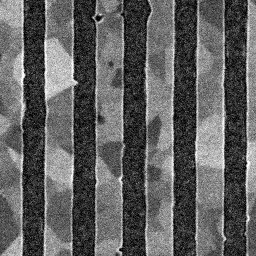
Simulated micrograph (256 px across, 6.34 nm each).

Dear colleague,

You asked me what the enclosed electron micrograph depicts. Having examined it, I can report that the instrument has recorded parallel lines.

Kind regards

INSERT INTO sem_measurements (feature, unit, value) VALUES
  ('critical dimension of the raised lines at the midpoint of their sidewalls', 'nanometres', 173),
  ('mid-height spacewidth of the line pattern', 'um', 0.147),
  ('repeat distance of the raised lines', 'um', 0.319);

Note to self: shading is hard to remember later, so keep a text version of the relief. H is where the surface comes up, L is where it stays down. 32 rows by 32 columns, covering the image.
HHHHLLHHHLLLHHHLLLLHHHLLLHHHLLLH
HHHLLLHHHLLLHHHLLLLHHHLLLHHHLLLH
HHHLLLHHHLLLHHHLHLLHHHLLLHHHLLLH
HHHLLLHHHLLLHHHLHLHHHHLLLHHHLLLH
HHHLLLHHHLLLHHHLLHHHHHLLLHHHLLLH
HHHLLLHHHLLLHHHLLHHHHHLLLHHHLLLH
HHHLLLHHHLLLHHHLLLHHHHLLLHHHHHHH
HHHLLLHHHLLLHHHLLLHHHHLLLHHHLLLH
HHHLLLHHHLLLHHHLLLHHHHLLLHHHLLLH
HHHLLLHHHLLLHHHLLLHHHHLLLHHHLLLH
HHHLLLHHHLLLHHHLLLHHHHLLLHHHLLLH
HHHLLLHHHLLLHHHLLLHHHHLLLHHHLLLH
HHHLLLHHHLLLHHHLLLHHHHLLLHHHLLLH
HHHLLLHHHLLLHHHLLLHHHHLLLHHHLLLH
HHHLLLHHHLLLHHHHLLHHHHLLLHHHLLLH
HHHLLLHHHLLLHHHHLLHHHHLLLHHHLLLH
HHHLLLHHHLLLHHHLLLHHHHLLLHHHLLLH
HHHLLLHHHLLLHHHLLLHHHHLLLHHHLLLH
HHHLLLHHHLLLHHHLLLHHHHLLHHHHLLLH
HHHLLLHHHLLLHHHLLLHHHHLLHHHHLLLH
HHHLLLHHHLLLHHHLLLHHHHLLHHHHLLLH
HHHLLLHHHLLLHHHLLLHHHHLLLHHHLLLH
HHHLLLHHHLLLHHHLLLHHHHLLLHHHLLLH
HHHLLLHHHLLLHHHLLLHHHHLLLHHHLLLH
HHHLLLHHHLLLHHHLLLHHHHLLLHHHLLLH
HHHLLLHHHLLLHHHHLLHHHLLLLHHHLLLH
HHHLLLHHHLLLHHHLLLHHHLLLLHHHLLLH
HHHLLLHHHLLLHHHLLLHHHLLLLHHHLLLH
HHHLLLHHHLLLHHHLLLHHHLLLLHHHLHHH
HHHLLLHHHLLLHHHLLLHHHHLLLHHHHHLH
HHHLLLHHHLLLHHHLLLHHHHLLHHHHLLLH
HHHLLLHHHLLLHHHLLLHHHHLLHHHHLLLH